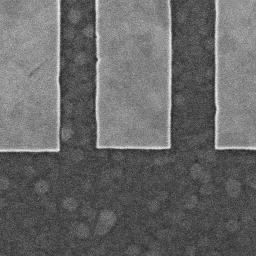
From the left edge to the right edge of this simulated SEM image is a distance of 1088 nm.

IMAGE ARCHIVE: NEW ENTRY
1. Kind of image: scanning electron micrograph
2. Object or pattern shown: one or a few lines or trenches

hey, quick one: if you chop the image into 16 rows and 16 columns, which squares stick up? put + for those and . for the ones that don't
++++..+++++...++
++++..+++++...++
++++..+++++...++
++++..+++++...++
++++..+++++...++
++++..+++++...++
++++..+++++...++
++++..+++++...++
++++..+++++...++
................
................
................
................
................
................
................